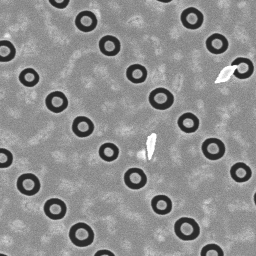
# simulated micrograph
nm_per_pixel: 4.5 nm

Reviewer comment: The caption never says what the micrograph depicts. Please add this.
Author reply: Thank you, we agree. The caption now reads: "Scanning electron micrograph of a regular array of ring-shaped grooves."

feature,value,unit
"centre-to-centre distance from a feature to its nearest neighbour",161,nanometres